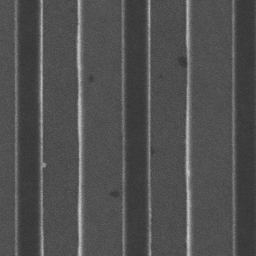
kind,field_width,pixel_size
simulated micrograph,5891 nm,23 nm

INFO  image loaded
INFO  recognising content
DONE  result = lines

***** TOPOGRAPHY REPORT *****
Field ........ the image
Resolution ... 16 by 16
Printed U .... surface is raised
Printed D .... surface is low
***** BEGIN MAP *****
UUUDDUUUUDDDUUUU
UUUDDUUUUDDDUUUU
UUUDDUUUUDDDUUUU
UUUDDUUUUDDDUUUU
UUUDDUUUUDDDUUUU
UUUDDUUUUDDDUUUU
UUUDDUUUUDDDUUUU
UUUDDUUUUDDDUUUU
UUUDDUUUUDDDUUUU
UUUDDUUUUDDDUUUU
UUUDDUUUUDDDUUUU
UUUDDUUUUDDDUUUU
UUUDDUUUUDDDUUUU
UUUDDUUUUDDDUUUU
UUUDDUUUUDDDUUUU
UUUDDUUUUDDDUUUU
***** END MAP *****